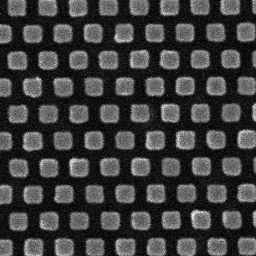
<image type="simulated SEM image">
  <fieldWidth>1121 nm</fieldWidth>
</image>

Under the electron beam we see a regular array of raised bodies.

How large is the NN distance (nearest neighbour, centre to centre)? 132 nm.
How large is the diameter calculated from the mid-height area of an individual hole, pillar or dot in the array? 19.3 px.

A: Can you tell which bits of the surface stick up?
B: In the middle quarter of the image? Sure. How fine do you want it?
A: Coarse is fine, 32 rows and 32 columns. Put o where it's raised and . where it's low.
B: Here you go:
..oooo...oooo....oooo....oooo...
................................
................................
.......................o......oo
oo...oooo....oooo....oooo...oooo
oo...oooo....oooo....oooo...oooo
oo...ooooo...oooo....oooo...oooo
oo....ooo....oooo....oooo....ooo
................................
................................
..ooo.....ooo....oooo....ooo....
..oooo...oooo....oooo.o..oooo...
..oooo...oooo....oooo.o..oooo...
.ooooo...ooooo...oooo....oooo...
..ooo......................o....
................................
................................
oo...oooo....oooo....oooo...oooo
oo...ooooo...oooo....oooo...oooo
oo...ooooo...oooo....oooo...oooo
oo...ooooo...oooo....oooo...oooo
................................
................................
................................
.ooooo...ooooo...oooo....oooo...
.ooooo...ooooo...oooo....oooo...
..oooo...ooooo...oooo....oooo...
..oooo....ooo....oooo....oooo...
................................
................................
..............ooo....oooo....ooo
oo...ooooo...oooo....oooo....ooo